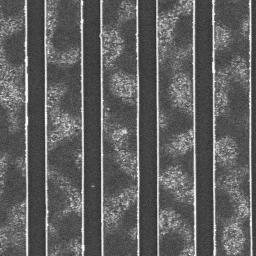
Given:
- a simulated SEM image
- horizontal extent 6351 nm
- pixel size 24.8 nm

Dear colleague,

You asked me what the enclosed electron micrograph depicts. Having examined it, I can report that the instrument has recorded parallel lines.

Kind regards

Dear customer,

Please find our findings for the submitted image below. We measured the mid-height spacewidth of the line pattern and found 0.471 um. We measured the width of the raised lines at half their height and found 918 nm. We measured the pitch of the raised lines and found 1390 nm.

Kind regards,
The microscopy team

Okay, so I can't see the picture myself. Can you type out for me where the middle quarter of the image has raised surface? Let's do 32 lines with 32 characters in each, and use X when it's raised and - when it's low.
XXXXX----XXXXXXXXX-----XXXXXXXXX
XXXXX----XXXXXXXXX-----XXXXXXXXX
XXXXX----XXXXXXXXX-----XXXXXXXXX
XXXXX----XXXXXXXXX-----XXXXXXXXX
XXXXX----XXXXXXXXX-----XXXXXXXXX
XXXXX-----XXXXXXXX-----XXXXXXXXX
XXXXX-----XXXXXXXXX----XXXXXXXXX
XXXXX-----XXXXXXXXX----XXXXXXXXX
XXXXX-----XXXXXXXXX----XXXXXXXXX
XXXXX-----XXXXXXXXX----XXXXXXXXX
XXXXX-----XXXXXXXXX-----XXXXXXXX
XXXXX-----XXXXXXXXX-----XXXXXXXX
XXXXX-----XXXXXXXXX-----XXXXXXXX
XXXXX-----XXXXXXXX------XXXXXXXX
XXXXX-----XXXXXXXX------XXXXXXXX
XXXXX-----XXXXXXXX------XXXXXXXX
XXXXX-----XXXXXXXX------XXXXXXXX
XXXXX-----XXXXXXXX------XXXXXXXX
XXXXX-----XXXXXXXX------XXXXXXXX
XXXXX-----XXXXXXXX------XXXXXXXX
XXXXX-----XXXXXXXX------XXXXXXXX
XXXXX-----XXXXXXXX------XXXXXXXX
XXXXX-----XXXXXXXX------XXXXXXXX
XXXXX-----XXXXXXXX------XXXXXXXX
XXXXX-----XXXXXXXX------XXXXXXXX
XXXXX-----XXXXXXXXX-----XXXXXXXX
XXXXX-----XXXXXXXXX-----XXXXXXXX
XXXXX-----XXXXXXXXX-----XXXXXXXX
XXXXX-----XXXXXXXXX-----XXXXXXXX
XXXXX-----XXXXXXXXX-----XXXXXXXX
XXXXX-----XXXXXXXXX-----XXXXXXXX
XXXXX-----XXXXXXXXX-----XXXXXXXX